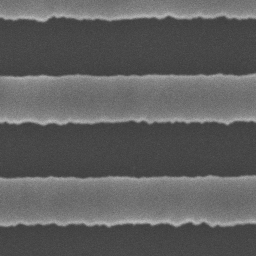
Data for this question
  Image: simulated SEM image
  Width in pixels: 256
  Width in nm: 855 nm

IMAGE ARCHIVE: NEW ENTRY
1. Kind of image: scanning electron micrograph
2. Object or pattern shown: lines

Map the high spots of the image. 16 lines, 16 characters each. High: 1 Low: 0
1111111111111111
0000000000000000
0000000000000000
0000000000000000
0000000000000000
1111111111111111
1111111111111111
1111111111111111
0000000000000000
0000000000000000
0000000000000000
1111111111111111
1111111111111111
1111111111111111
0000000000000000
0000000000000000